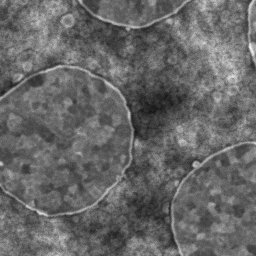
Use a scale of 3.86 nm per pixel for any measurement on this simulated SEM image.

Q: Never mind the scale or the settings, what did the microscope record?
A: raised bodies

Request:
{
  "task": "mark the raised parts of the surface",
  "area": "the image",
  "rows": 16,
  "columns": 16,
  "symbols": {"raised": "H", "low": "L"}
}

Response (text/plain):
LLLLLHHHHHHLLLLL
LLLLLLLHHLLLLLLL
LLLLLLLLLLLLLLLL
LLLLLLLLLLLLLLLL
LLLHHLLLLLLLLLLL
LHHHHHHLLLLLLLLL
HHHHHHHHLLLLLLLL
HHHHHHHHLLLLLLLL
HHHHHHHHLLLLLLLL
HHHHHHHHLLLLLLHH
HHHHHHHHLLLLHHHH
HHHHHHHLLLLHHHHH
LHHHHHLLLLLHHHHH
LLLLLLLLLLLHHHHH
LLLLLLLLLLLHHHHH
LLLLLLLLLLLHHHHH